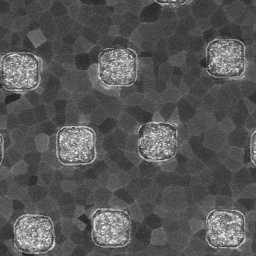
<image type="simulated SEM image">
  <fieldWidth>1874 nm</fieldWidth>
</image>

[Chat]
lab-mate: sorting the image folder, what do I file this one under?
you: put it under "a regular array of holes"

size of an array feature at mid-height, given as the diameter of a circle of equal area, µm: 0.295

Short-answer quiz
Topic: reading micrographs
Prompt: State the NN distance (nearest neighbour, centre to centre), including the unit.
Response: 0.612 microns